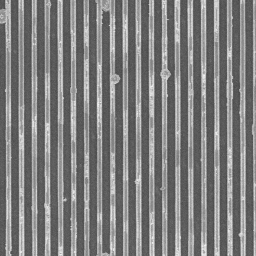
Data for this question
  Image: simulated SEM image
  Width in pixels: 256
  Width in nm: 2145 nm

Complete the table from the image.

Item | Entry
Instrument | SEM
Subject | parallel lines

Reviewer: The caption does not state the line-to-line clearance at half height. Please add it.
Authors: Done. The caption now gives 75.4 nm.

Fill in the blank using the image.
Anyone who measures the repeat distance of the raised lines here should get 109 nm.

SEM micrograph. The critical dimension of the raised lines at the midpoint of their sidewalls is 37.7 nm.